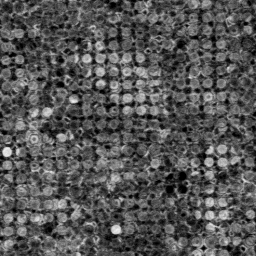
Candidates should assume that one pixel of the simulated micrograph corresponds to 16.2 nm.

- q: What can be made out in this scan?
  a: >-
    a regular array of raised bodies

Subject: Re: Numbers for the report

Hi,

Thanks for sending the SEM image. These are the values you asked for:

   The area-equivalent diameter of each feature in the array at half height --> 144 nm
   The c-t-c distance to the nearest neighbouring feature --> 0.181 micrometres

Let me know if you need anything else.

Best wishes